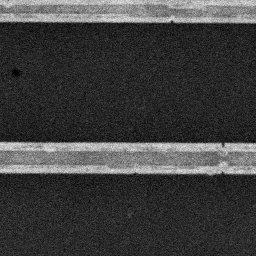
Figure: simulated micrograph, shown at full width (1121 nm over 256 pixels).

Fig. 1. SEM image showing one or a few lines or trenches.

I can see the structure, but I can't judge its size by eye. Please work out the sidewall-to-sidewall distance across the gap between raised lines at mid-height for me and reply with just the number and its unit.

551 nm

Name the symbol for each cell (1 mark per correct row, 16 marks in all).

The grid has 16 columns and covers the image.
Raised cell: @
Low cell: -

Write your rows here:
@@@@@@@@@@@@@@@@
----------------
----------------
----------------
----------------
----------------
----------------
----------------
----------------
@@@@@@@@@@@@@@@@
@@@@@@@@@@@@@@@@
----------------
----------------
----------------
----------------
----------------